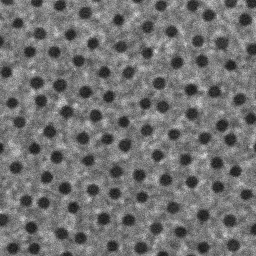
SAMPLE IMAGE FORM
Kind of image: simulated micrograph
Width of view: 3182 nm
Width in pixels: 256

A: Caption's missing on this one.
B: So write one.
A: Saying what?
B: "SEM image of a regular array of holes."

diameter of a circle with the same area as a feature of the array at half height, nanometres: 167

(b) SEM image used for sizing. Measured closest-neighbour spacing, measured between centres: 292 nm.